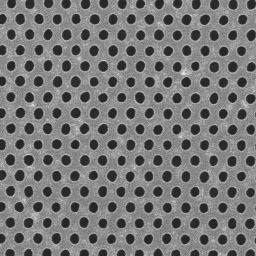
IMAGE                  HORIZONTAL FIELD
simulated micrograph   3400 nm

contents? a regular array of holes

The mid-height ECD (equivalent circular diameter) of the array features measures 0.132 µm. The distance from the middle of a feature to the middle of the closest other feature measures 236 nm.